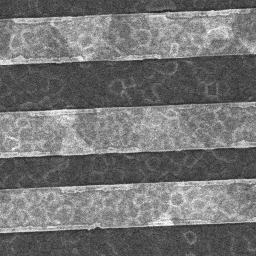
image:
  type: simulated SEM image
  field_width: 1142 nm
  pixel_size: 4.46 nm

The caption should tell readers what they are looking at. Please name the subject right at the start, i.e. one or a few lines or trenches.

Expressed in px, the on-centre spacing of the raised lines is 84.4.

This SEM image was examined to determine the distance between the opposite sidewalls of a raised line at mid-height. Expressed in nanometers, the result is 200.